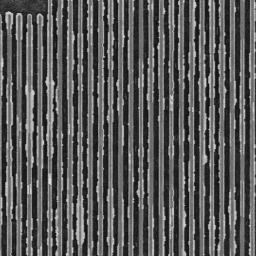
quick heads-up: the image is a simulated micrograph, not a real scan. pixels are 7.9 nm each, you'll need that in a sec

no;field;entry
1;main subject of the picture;parallel lines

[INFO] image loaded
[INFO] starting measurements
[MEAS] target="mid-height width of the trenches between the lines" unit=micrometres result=0.0375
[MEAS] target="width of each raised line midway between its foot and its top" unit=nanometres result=44.4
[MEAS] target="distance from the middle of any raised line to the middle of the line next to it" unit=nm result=80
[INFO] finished